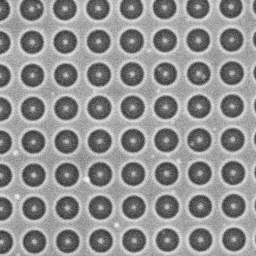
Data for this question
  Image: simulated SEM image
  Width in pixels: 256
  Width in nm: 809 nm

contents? an array of small figures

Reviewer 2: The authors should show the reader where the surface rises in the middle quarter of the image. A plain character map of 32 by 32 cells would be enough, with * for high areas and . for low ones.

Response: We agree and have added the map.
..*****....****....****.....***.
...***......**......***.....***.
*...**..*...**......**...*..***.
...***......**......***.....***.
...***.....****....****.....****
..*****...******..*******.******
********************************
********************************
..*****....****....****.....****
...***......**......***.....***.
....**......**......**...*...**.
....**......**......**......***.
...***......**......***.....***.
...****....****....*****...*****
********************************
********************************
..*****...******...*****...*****
...***.....****.....***.....***.
....**......**......**.......**.
*...**......**......**...*...**.
....**......**......***.....***.
...****....****....*****....****
.*******.***********************
********************************
********..*******.*******.******
...****....****.....***.....****
....**......**......***......**.
*...**...*..**...*...*...*...**.
....**......**......***......**.
...***.....****.....***.....****
..******..******..*******.******
********************************